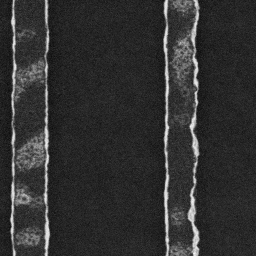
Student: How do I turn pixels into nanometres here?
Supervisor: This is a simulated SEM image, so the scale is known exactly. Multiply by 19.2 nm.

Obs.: one or a few lines or trenches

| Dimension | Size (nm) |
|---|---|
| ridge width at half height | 611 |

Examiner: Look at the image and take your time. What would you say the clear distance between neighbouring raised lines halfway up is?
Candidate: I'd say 2300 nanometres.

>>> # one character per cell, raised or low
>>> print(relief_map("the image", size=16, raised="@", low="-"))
-@@-------@@----
-@@-------@@----
-@@-------@@----
-@@-------@@----
-@@-------@@----
-@@-------@@----
-@@-------@@----
-@@-------@@----
-@@-------@@----
-@@-------@@----
-@@-------@@----
-@@-------@@----
-@@-------@@----
-@@-------@@----
-@@-------@@----
-@@-------@@----